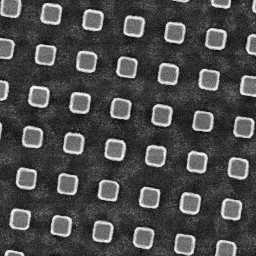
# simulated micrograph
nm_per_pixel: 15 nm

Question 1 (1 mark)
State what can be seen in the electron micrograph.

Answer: a regular array of raised bodies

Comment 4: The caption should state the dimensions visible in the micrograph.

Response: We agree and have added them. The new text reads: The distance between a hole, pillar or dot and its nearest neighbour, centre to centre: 615 nm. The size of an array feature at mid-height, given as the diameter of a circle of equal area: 311 nm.